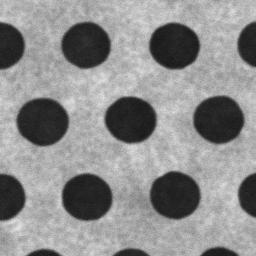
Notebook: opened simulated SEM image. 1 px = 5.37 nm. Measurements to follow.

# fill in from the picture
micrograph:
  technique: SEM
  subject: holes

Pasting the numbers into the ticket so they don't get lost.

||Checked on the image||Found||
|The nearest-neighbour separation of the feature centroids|465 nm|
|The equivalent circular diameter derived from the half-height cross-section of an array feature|0.266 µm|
